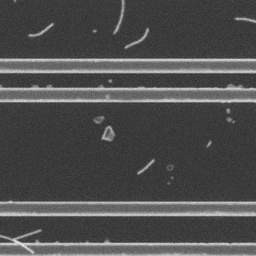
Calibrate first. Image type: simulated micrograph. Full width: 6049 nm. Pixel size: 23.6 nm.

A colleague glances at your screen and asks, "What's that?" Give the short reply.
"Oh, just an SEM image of lines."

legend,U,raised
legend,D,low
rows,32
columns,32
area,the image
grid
DDDDDDDDDDDDDDDDDDDDDDDDDDDDDDDD
DDDDDDDDDDDDDDDDDDDDDDDDDDDDDDDD
DDDDDDDDDDDDDDDDDDDDDDDDDDDDDDDD
DDDDDDDDDDDDDDDDDDDDDDDDDDDDDDDD
DDDDDDDDDDDDDDDDDDDDDDDDDDDDDDDD
DDDDDDDDDDDDDDDDDDDDDDDDDDDDDDDD
DDDDDDDDDDDDDDDDDDDDDDDDDDDDDDDD
UUUUUUUUUUUUUUUUUUUUUUUUUUUUUUUU
UUUUUUUUUUUUUUUUUUUUUUUUUUUUUUUU
DDDDDDDDDDDDDDDDDDDDDDDDDDDDDDDD
DDDDDDDDDDDDDDDDDDDDDDDDDDDDDDDD
UUUUUUUUUUUUUUUUUUUUUUUUUUUUUUUU
UUUUUUUUUUUUUUUUUUUUUUUUUUUUUUUU
DDDDDDDDDDDDDDDDDDDDDDDDDDDDDDDD
DDDDDDDDDDDDDDDDDDDDDDDDDDDDDDDD
DDDDDDDDDDDDDDDDDDDDDDDDDDDDDDDD
DDDDDDDDDDDDDUDDDDDDDDDDDDDDDDDD
DDDDDDDDDDDDDDDDDDDDDDDDDDDDDDDD
DDDDDDDDDDDDDDDDDDDDDDDDDDDDDDDD
DDDDDDDDDDDDDDDDDDDDDDDDDDDDDDDD
DDDDDDDDDDDDDDDDDDDDDDDDDDDDDDDD
DDDDDDDDDDDDDDDDDDDDDDDDDDDDDDDD
DDDDDDDDDDDDDDDDDDDDDDDDDDDDDDDD
DDDDDDDDDDDDDDDDDDDDDDDDDDDDDDDD
DDDDDDDDDDDDDDDDDDDDDDDDDDDDDDDD
UUUUUUUUUUUUUUUUUUUUUUUUUUUUUUUU
UUUUUUUUUUUUUUUUUUUUUUUUUUUUUUUU
DDDDDDDDDDDDDDDDDDDDDDDDDDDDDDDD
DDDDDDDDDDDDDDDDDDDDDDDDDDDDDDDD
DDDDDDDDDDDDDDDDDDDDDDDDDDDDDDDD
UUUUUUUUUUUUUUUUUUUUUUUUUUUUUUUU
UUUUUUUUUUUUUUUUUUUUUUUUUUUUUUUU